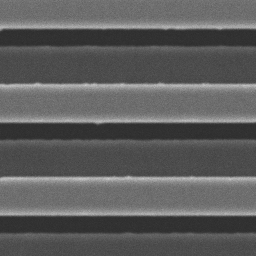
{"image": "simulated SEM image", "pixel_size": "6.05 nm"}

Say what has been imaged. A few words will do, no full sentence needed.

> lines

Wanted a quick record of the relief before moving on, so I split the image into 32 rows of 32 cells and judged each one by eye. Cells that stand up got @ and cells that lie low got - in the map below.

@@@@@@@@@@@@@@@@@@@@@@@@@@@@@@@@
@@@@@@@@@@@@@@@@@@@@@@@@@@@@@@@@
@@@@@@@@@@@@@@@@@@@@@@@@@@@@@@@@
@@@@@@@@@@@@@@@@@@@@@@@@@@@@@@@@
--------------------------------
--------------------------------
@@@@@@@@@@@@@@@@@@@@@@@@@@@@@@@@
@@@@@@@@@@@@@@@@@@@@@@@@@@@@@@@@
@@@@@@@@@@@@@@@@@@@@@@@@@@@@@@@@
@@@@@@@@@@@@@@@@@@@@@@@@@@@@@@@@
@@@@@@@@@@@@@@@@@@@@@@@@@@@@@@@@
@@@@@@@@@@@@@@@@@@@@@@@@@@@@@@@@
@@@@@@@@@@@@@@@@@@@@@@@@@@@@@@@@
@@@@@@@@@@@@@@@@@@@@@@@@@@@@@@@@
@@@@@@@@@@@@@@@@@@@@@@@@@@@@@@@@
--------------------------------
--------------------------------
--------------------------------
@@@@@@@@@@@@@@@@@@@@@@@@@@@@@@@@
@@@@@@@@@@@@@@@@@@@@@@@@@@@@@@@@
@@@@@@@@@@@@@@@@@@@@@@@@@@@@@@@@
@@@@@@@@@@@@@@@@@@@@@@@@@@@@@@@@
@@@@@@@@@@@@@@@@@@@@@@@@@@@@@@@@
@@@@@@@@@@@@@@@@@@@@@@@@@@@@@@@@
@@@@@@@@@@@@@@@@@@@@@@@@@@@@@@@@
@@@@@@@@@@@@@@@@@@@@@@@@@@@@@@@@
@@@@@@@@@@@@@@@@@@@@@@@@@@@@@@@@
--------------------------------
--------------------------------
@@@@@@@@@@@@@@@@@@@@@@@@@@@@@@@@
@@@@@@@@@@@@@@@@@@@@@@@@@@@@@@@@
@@@@@@@@@@@@@@@@@@@@@@@@@@@@@@@@